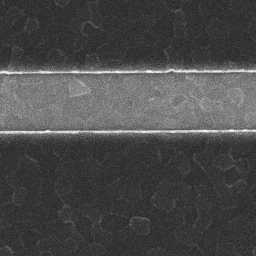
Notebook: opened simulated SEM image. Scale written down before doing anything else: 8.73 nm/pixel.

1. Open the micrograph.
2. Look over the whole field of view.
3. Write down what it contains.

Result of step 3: one or a few lines or trenches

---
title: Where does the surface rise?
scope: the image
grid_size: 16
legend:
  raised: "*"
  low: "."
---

****************
****************
****************
****************
************....
................
................
................
****************
****************
****************
****************
****************
****************
****************
****************